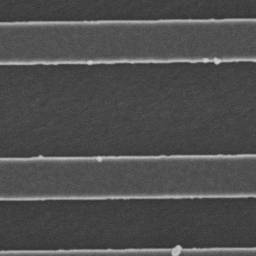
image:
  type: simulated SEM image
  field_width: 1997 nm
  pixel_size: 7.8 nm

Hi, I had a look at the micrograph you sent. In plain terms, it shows lines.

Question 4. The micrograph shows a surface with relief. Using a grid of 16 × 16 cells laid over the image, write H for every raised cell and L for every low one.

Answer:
LLLLLLLLLLLLLLLL
HHHHHHHHHHHHHHHH
HHHHHHHHHHHHHHHH
HHHHHHHHHHHHHHHH
LLLLLLLLLLLLLLLL
LLLLLLLLLLLLLLLL
LLLLLLLLLLLLLLLL
LLLLLLLLLLLLLLLL
LLLLLLLLLLLLLLLL
LLLLLLLLLLLLLLLL
HHHHHHHHHHHHHHHH
HHHHHHHHHHHHHHHH
LLLLLLLLLLLLLLLL
LLLLLLLLLLLLLLLL
LLLLLLLLLLLLLLLL
LLLLLLLLLLLHLLLL